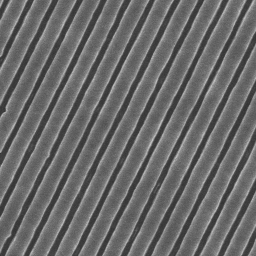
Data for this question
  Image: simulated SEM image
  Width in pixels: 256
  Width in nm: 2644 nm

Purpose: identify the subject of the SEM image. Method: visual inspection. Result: parallel lines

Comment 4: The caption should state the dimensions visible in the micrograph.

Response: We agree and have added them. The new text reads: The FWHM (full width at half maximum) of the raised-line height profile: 162 nm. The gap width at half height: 62.5 nm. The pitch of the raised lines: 225 nm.